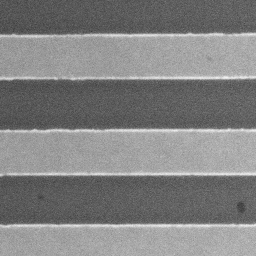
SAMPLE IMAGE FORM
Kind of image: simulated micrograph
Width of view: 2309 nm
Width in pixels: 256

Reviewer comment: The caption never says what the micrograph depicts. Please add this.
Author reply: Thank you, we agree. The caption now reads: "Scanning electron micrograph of lines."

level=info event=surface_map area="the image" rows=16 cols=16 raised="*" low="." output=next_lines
................
................
****************
****************
****************
................
................
................
****************
****************
****************
................
................
................
****************
****************